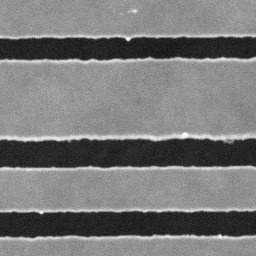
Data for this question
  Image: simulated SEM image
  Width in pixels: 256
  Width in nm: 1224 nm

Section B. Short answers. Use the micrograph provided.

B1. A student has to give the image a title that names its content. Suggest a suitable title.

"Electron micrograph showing lines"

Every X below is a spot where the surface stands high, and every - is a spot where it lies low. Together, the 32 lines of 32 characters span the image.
XXXXXXXXXXXXXXXXXXXXXXXXXXXXXXXX
XXXXXXXXXXXXXXXXXXXXXXXXXXXXXXXX
XXXXXXXXXXXXXXXXXXXXXXXXXXXXXXXX
XXXXXXXXXXXXXXXXXXXXXXXXXXXXXXXX
XXXXXXXXXXXXXXXXXXXXXXXXXXXXXXXX
--------------------------------
--------------------------------
XX---X--XX-X--XXXXXXXXXXXXXXXXXX
XXXXXXXXXXXXXXXXXXXXXXXXXXXXXXXX
XXXXXXXXXXXXXXXXXXXXXXXXXXXXXXXX
XXXXXXXXXXXXXXXXXXXXXXXXXXXXXXXX
XXXXXXXXXXXXXXXXXXXXXXXXXXXXXXXX
XXXXXXXXXXXXXXXXXXXXXXXXXXXXXXXX
XXXXXXXXXXXXXXXXXXXXXXXXXXXXXXXX
XXXXXXXXXXXXXXXXXXXXXXXXXXXXXXXX
XXXXXXXXXXXXXXXXXXXXXXXXXXXXXXXX
XXXXXXXXXXXXXXXXXXXXXXXXXXXXXXXX
--XXXX-X-----------X------------
--------------------------------
--------------------------------
--------------------------------
XXXXXXXXXXXXXXXXXXXXXXXXXXXXXXXX
XXXXXXXXXXXXXXXXXXXXXXXXXXXXXXXX
XXXXXXXXXXXXXXXXXXXXXXXXXXXXXXXX
XXXXXXXXXXXXXXXXXXXXXXXXXXXXXXXX
XXXXXXXXXXXXXXXXXXXXXXXXXXXXXXXX
-----X--------------------------
--------------------------------
--------------------------------
-------------------XXXXX--------
XXXXXXXXXXXXXXXXXXXXXXXXXXXXXXXX
XXXXXXXXXXXXXXXXXXXXXXXXXXXXXXXX